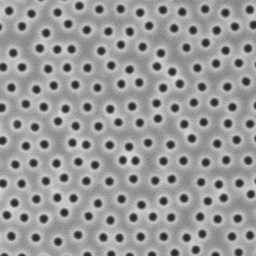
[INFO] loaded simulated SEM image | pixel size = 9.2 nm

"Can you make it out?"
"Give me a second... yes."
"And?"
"a regular array of holes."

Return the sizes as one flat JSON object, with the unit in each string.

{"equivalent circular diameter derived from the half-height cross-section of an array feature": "85 nanometers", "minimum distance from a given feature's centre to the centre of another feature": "160 nm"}